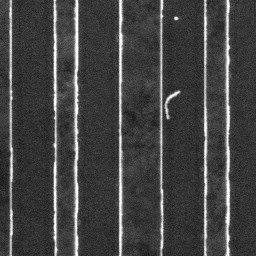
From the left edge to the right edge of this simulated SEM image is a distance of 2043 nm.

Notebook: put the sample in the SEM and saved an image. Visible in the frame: lines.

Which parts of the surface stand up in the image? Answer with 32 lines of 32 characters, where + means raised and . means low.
+......+++.....+++++......+++...
+......+++.....+++++......++....
+......+++.....+++++......++....
+......+++.....+++++......++....
+......+++.....+++++......++....
+......+++.....+++++......++....
+......+++.....+++++......++....
+......+++.....+++++......+++...
+......+++.....+++++......++....
+......+++.....+++++......++....
+......+++.....+++++......++....
+......+++.....+++++......++....
+......+++.....+++++......++....
+......+++.....+++++......++....
+......+++.....+++++......+++...
+......+++.....+++++......+++...
+......+++.....+++++......++....
+......+++.....+++++......++....
+......+++.....+++++......+++...
+......+++.....+++++......+++...
+......+++.....+++++......+++...
+......+++.....+++++......++....
+......+++.....+++++......++....
+......+++.....+++++......+++...
+......+++.....+++++......+++...
+......+++.....+++++......+++...
+......+++.....+++++......+++...
+......+++.....+++++......+++...
+......+++.....+++++......++....
+......+++.....+++++......++....
+......+++.....+++++......++....
+......+++.....+++++......++....